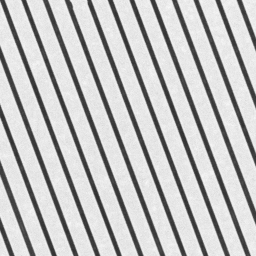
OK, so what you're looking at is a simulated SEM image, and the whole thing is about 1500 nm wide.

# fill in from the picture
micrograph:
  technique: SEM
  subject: parallel lines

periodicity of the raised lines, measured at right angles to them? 0.118 µm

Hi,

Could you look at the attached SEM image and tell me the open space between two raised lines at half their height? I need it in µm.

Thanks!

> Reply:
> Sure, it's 0.0295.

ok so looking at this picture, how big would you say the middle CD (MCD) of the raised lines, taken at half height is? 0.0891 um